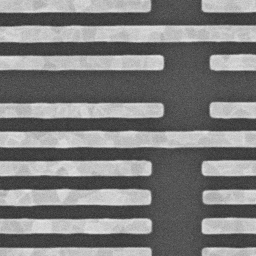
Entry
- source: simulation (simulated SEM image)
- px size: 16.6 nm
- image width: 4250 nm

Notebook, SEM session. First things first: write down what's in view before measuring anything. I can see wiring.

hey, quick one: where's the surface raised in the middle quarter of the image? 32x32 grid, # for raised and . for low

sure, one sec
#########################.......
................................
................................
................................
................................
................................
................................
................................
................................
................................
#########################.......
#########################.......
#########################.......
................................
................................
................................
................................
################################
################################
################################
################################
................................
................................
................................
#####################...........
######################..........
######################..........
######################..........
................................
................................
................................
#........#####..##..............